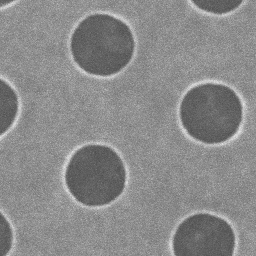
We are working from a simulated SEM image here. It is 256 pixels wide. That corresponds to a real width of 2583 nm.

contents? holes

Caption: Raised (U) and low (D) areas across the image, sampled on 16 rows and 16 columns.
UUUUUUUUUUUUDDDU
UUUUUDDDUUUUUUUU
UUUUDDDDUUUUUUUU
UUUUUDDDUUUUUUUU
UUUUUDDUUUUUUUUU
DUUUUUUUUUUUDDUU
DUUUUUUUUUUDDDDU
DUUUUUUUUUUDDDDU
UUUUUUUUUUUUDDDU
UUUUUDDUUUUUUUUU
UUUUDDDDUUUUUUUU
UUUUDDDDUUUUUUUU
UUUUUDDUUUUUUUUU
UUUUUUUUUUUUDUUU
DUUUUUUUUUUDDDDU
DUUUUUUUUUUDDDDU